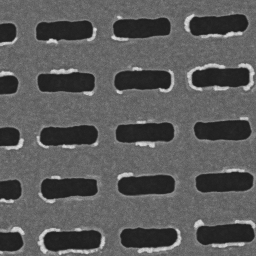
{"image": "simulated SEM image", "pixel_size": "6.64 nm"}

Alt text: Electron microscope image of a regular array of holes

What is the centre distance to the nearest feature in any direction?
0.347 um